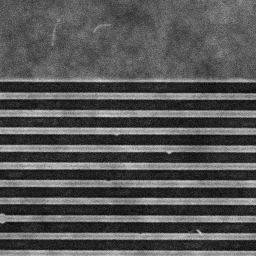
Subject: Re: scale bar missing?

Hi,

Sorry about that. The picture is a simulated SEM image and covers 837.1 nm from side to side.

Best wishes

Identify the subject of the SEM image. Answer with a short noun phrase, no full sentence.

parallel lines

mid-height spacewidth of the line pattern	10.9	pixels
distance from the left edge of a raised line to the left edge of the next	57.3	nm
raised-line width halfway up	20.5	nanometres